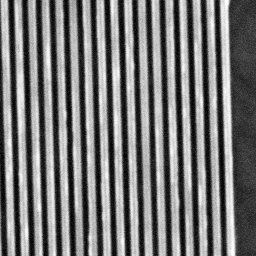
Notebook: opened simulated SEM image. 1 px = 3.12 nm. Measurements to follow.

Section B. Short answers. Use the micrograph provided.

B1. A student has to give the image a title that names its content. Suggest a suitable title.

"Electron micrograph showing parallel lines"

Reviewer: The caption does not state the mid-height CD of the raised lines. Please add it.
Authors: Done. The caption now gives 20.6 nanometres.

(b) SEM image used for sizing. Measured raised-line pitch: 0.0428 µm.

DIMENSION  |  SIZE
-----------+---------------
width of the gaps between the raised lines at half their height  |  20.6 nm